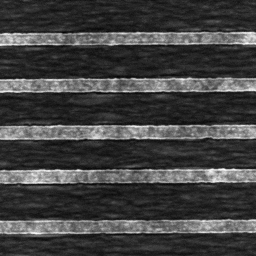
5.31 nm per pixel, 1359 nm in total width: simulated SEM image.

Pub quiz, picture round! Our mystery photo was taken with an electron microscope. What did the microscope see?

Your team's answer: parallel lines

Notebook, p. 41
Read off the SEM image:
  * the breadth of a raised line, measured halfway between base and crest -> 11.9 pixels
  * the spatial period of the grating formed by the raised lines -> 250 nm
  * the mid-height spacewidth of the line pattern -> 181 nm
